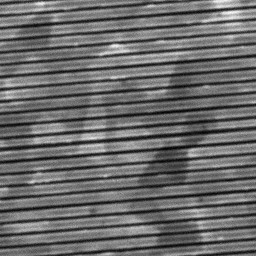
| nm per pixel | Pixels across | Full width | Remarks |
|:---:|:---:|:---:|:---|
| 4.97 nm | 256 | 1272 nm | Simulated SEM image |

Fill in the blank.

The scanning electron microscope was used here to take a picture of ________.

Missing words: parallel lines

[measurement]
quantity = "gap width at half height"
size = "0.0179 micrometres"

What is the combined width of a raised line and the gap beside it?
0.0605 um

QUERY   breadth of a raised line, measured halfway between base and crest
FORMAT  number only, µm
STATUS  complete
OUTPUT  0.0439